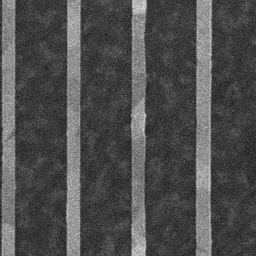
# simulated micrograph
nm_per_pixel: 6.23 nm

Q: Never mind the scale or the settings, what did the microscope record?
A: one or a few lines or trenches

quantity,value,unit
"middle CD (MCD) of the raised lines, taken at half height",0.0748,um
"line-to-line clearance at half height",332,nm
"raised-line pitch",405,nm